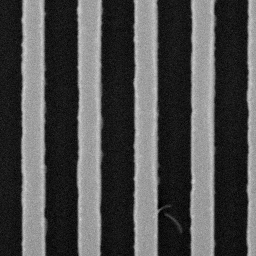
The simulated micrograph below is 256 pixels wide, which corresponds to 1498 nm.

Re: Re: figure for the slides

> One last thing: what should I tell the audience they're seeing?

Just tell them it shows lines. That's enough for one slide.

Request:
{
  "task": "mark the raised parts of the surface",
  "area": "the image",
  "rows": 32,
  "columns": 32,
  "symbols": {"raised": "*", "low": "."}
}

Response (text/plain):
...***....***....***....***....*
...***....***....***....***....*
...***....***....***....***....*
...***....***....***....***....*
...***....***....***....***....*
...***....***....***....***....*
...***....***....***....***....*
...***....***....***....***....*
...***....***....***....***....*
...***....***....***....***....*
...***....***....***....***....*
...***....**.....***....***....*
...***....***....***....***....*
...***....***....***....***....*
...***....***....***....***....*
...***....***....***....***....*
...***....***....***....***....*
...***....***....***....***....*
...***....***....***....***....*
...***....***....***....***....*
...***....**.....***....***....*
...***....***....***....***....*
...***....***....***....***....*
...***....***....***....***....*
...***....***....***....***....*
...***....**.....***....***....*
...***....***....***....***....*
...***....***....***....***....*
...***....***....***....***....*
...***....***....***....***....*
...***....**.....***....***....*
...***....**.....***....***....*